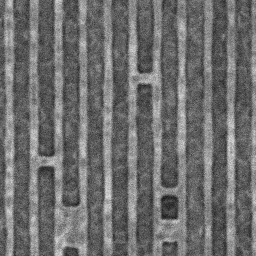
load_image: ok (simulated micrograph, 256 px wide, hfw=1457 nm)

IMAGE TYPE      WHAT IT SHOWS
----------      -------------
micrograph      parallel lines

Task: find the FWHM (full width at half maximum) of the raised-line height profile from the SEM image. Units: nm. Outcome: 44.8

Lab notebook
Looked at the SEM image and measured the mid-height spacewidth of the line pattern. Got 0.096 micrometres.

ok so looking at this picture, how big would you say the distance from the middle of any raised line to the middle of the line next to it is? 140 nm